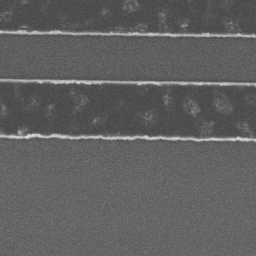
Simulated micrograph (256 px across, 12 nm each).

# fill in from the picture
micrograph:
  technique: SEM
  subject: one or a few lines or trenches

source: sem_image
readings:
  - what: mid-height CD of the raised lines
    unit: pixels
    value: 55.9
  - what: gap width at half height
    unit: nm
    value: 575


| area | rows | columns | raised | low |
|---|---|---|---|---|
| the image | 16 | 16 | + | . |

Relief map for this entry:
++++++++++++++++
++++++++++++++++
................
................
................
++++++++++++++++
++++++++++++++++
++++++++++++++++
++++++++++++++++
................
................
................
................
................
................
................